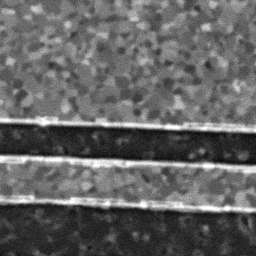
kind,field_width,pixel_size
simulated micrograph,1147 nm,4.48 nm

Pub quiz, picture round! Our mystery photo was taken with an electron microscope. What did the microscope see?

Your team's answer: one or a few lines or trenches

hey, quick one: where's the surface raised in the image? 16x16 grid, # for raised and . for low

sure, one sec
################
################
################
################
################
################
################
################
................
................
################
################
################
................
................
................